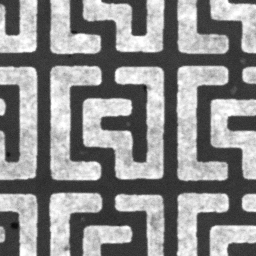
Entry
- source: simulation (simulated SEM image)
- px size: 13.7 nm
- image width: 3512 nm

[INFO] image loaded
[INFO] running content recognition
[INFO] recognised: wiring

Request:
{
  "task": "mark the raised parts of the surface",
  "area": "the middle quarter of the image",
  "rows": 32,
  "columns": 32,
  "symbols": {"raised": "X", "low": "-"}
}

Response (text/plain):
--------------------------------
XXXXXXXXX-----XXXXXXXXXX-----XXX
XXXXXXXXX----XXXXXXXXXXXX----XXX
XXXXXXXXX----XXXXXXXXXXXX----XXX
XXXXXXXXX-----XXXXXXXXXXX----XXX
X--------------------XXXX----XXX
X--------------------XXXX----XXX
X--------------------XXXX----XXX
X--------------------XXXX----XXX
X----XXXXXXXXXXX-----XXXX----XXX
X----XXXXXXXXXXXX----XXXX----XXX
X----XXXXXXXXXXXX----XXXX----XXX
X----XXXXXXXXXX------XXXX----XXX
X----XXXX------------XXXX----XXX
X----XXXX------------XXXX----XXX
X----XXXX------------XXXX----XXX
X----XXXX------------XXXX----XXX
X----XXXXXXXXXXX-----XXXX----XXX
X----XXXXXXXXXXXX----XXXX----XXX
X----XXXXXXXXXXXX----XXX-----XXX
X-----XXXXXXXXXXX----XXX-----XXX
X------------XXXX----XXX-----XXX
X------------XXXX----XXX-----XXX
X------------XXXX----XXX-----XXX
XX-----------XXXX----XXX-----XXX
XXXXXXXXX----XXXXXXXXXXX-----XXX
XXXXXXXXX----XXXXXXXXXXX-----XXX
XXXXXXXXX----XXXXXXXXXXX-----XXX
XXXXXXXX---------------------XXX
--------------------------------
--------------------------------
--------------------------------